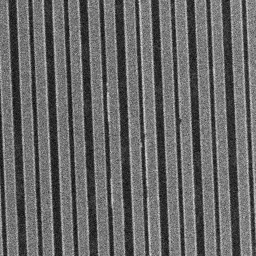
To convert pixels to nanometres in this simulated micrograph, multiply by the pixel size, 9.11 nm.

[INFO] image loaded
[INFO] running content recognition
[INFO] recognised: parallel lines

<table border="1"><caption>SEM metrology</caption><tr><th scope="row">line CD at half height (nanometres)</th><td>88.7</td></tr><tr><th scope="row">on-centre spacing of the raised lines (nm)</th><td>163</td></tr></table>